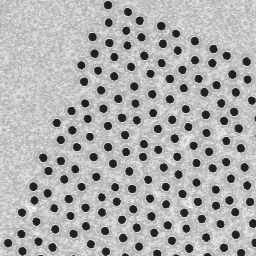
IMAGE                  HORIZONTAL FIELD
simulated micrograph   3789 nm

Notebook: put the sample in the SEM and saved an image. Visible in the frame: a regular array of holes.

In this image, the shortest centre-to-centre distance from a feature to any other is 244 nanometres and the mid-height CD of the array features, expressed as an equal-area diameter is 123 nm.